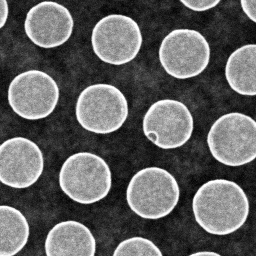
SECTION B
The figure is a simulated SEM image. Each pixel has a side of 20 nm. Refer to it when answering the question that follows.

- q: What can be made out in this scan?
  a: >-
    a regular array of raised bodies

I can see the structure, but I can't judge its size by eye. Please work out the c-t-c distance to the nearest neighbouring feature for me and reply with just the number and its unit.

1380 nm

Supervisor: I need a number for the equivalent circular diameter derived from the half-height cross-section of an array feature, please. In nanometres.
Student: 980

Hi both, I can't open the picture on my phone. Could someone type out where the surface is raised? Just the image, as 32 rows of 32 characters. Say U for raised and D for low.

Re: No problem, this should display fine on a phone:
UDDDDUUDDDDDDDDDDDDDDDDUUUUDDDUU
UDDDUUUUDDDDDDDDDDDDDDDDDDDDDDDU
UDDUUUUUUDDDDUUUDDDDDDDDDDDDDDDD
DDDUUUUUUDDDUUUUUDDDDDDDDDDDDDDD
DDDDUUUUUDDDUUUUUUDDDUUUUDDDDDDD
DDDDDUUUDDDDUUUUUUDDUUUUUUDDDDDD
DDDDDDDDDDDDUUUUUDDDUUUUUUDDDUUU
DDDDDDDDDDDDDUUUDDDDUUUUUUDDDUUU
DDDDDDDDDDDDDDDDDDDDDUUUUUDDUUUU
DDUUUUDDDDDDDDDDDDDDDDUUDDDDUUUU
DUUUUUUDDDDDDDDDDDDDDDDDDDDDDUUU
DUUUUUUDDDUUUUUDDDDDDDDDDDDDDDUU
DUUUUUUDDDUUUUUUDDDDDDDDDDDDDDDD
DDUUUUUDDDUUUUUUDDDUUUUDDDDDDDDD
DDDUUUDDDDUUUUUUDDUUUUUUDDDDUUUD
DDDDDDDDDDUUUUUDDDUUUUUUDDDUUUUU
DDDDDDDDDDDDUUDDDDUUUUUUDDUUUUUU
DUUDDDDDDDDDDDDDDDDUUUUDDDUUUUUU
UUUUUDDDDDDDDDDDDDDDDDDDDDUUUUUU
UUUUUDDDDUUUDDDDDDDDDDDDDDDUUUUU
UUUUUDDDUUUUUDDDDDDDDDDDDDDDUUDD
UUUUUDDDUUUUUUDDDDUUUDDDDDDDDDDD
UUUUDDDDUUUUUUDDUUUUUUDDDDDDDDDD
DDDDDDDDUUUUUUDDUUUUUUDDDUUUUUDD
DDDDDDDDDUUUUDDDUUUUUUDDUUUUUUUD
DDDDDDDDDDDDDDDDUUUUUUDDUUUUUUUD
UUDDDDDDDDDDDDDDDUUUUDDDUUUUUUUD
UUUDDDDDDDDDDDDDDDDDDDDDDUUUUUUD
UUUDDDDUUUUDDDDDDDDDDDDDDDUUUUDD
UUUDDDUUUUUUDDDDDDDDDDDDDDDDDDDD
UUUDDDUUUUUUDDDUUUUDDDDDDDDDDDDD
UUDDDDUUUUUUDDUUUUUUDDDDDDDDDDDD